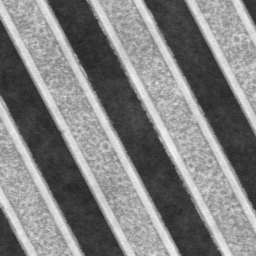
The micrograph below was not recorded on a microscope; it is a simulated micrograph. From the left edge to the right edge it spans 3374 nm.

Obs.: one or a few lines or trenches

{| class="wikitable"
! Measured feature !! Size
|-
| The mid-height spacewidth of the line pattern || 614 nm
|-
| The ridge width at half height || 522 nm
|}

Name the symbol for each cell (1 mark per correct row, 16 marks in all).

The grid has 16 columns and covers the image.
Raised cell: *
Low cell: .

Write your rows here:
***...***...***.
.**....**....**.
.***...***...***
..**....**....**
..***...***...**
...**....***...*
...***...***...*
....**....***...
*...***...***...
*....**....***..
**...***...***..
***...***...***.
***...***...***.
.***...***...***
.***...***....**
..***...***...**